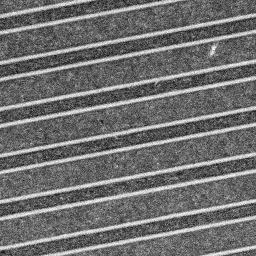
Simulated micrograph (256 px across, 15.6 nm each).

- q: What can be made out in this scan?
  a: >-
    parallel lines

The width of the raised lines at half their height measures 472 nanometres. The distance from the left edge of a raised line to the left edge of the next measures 710 nm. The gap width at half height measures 243 nm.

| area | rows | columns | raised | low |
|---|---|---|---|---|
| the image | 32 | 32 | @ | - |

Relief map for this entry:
@@@@@@@@@----------@@@@@@@@@@@@@
@@@@----------@@@@@@@@@@@@@@@@@@
--------@@@@@@@@@@@@@@@@@@@@@---
---@@@@@@@@@@@@@@@@@@@@---------
@@@@@@@@@@@@@@@@@@-----------@@@
@@@@@@@@@@@@@----------@@@@@@@@@
@@@@@@@-----------@@@@@@@@@@@@@@
@@-----------@@@@@@@@@@@@@@@@@@@
-------@@@@@@@@@@@@@@@@@@@@@----
--@@@@@@@@@@@@@@@@@@@@@---------
@@@@@@@@@@@@@@@@@----------@@@@@
@@@@@@@@@@@@----------@@@@@@@@@@
@@@@@@@----------@@@@@@@@@@@@@@@
@----------@@@@@@@@@@@@@@@@@@@@@
------@@@@@@@@@@@@@@@@@@@@@-----
-@@@@@@@@@@@@@@@@@@@@-----------
@@@@@@@@@@@@@@@@-----------@@@@@
@@@@@@@@@@@----------@@@@@@@@@@@
@@@@@-----------@@@@@@@@@@@@@@@@
-----------@@@@@@@@@@@@@@@@@@@@-
-----@@@@@@@@@@@@@@@@@@@@@------
@@@@@@@@@@@@@@@@@@@@-----------@
@@@@@@@@@@@@@@@-----------@@@@@@
@@@@@@@@@@----------@@@@@@@@@@@@
@@@@@----------@@@@@@@@@@@@@@@@@
----------@@@@@@@@@@@@@@@@@@@@--
-----@@@@@@@@@@@@@@@@@@@--------
@@@@@@@@@@@@@@@@@@@-----------@@
@@@@@@@@@@@@@@----------@@@@@@@@
@@@@@@@@-----------@@@@@@@@@@@@@
@@@-----------@@@@@@@@@@@@@@@@@@
--------@@@@@@@@@@@@@@@@@@@@@---